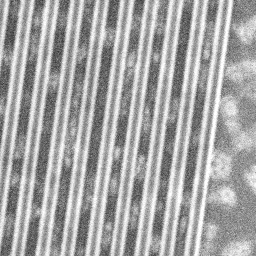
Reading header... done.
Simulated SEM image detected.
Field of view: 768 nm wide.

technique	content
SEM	parallel lines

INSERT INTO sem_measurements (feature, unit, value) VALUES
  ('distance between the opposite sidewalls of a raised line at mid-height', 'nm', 30.8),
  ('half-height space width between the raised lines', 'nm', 45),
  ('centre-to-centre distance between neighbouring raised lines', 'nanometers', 73.9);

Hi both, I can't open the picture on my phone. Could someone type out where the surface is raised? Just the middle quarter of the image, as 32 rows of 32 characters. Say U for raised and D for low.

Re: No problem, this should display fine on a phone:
UUDDDDUUDDDDUUUDDDDUUDDDDUUDDDDU
UUDDDDUUDDDDUUUDDDUUUDDDDUUDDDDU
UUDDDDUUDDDDUUUDDDUUDDDDUUUDDDDU
UUDDDDUUDDDDUUDDDDUUDDDDUUUDDDUU
UUDDDDUUDDDDUUDDDDUUDDDDUUUDDDUU
UUDDDDUUDDDDUUDDDDUUDDDDUUDDDDUU
UDDDDUUUDDDDUUDDDDUUDDDDUUDDDDUU
UDDDDUUDDDDUUUDDDDUUDDDDUUDDDDUU
UDDDDUUDDDDUUUDDDUUUDDDDUUDDDDUU
UDDDDUUDDDDUUDDDDUUDDDDUUUDDDDUU
UDDDDUUDDDDUUDDDDUUDDDDUUUDDDUUU
UDDDDUUDDDDUUDDDDUUDDDDUUUDDDUUU
UDDDDUUDDDDUUDDDDUUDDDDUUDDDDUUU
DDDDUUUDDDDUUDDDDUUDDDDUUDDDDUUD
DDDDUUDDDDUUUDDDDUUDDDDUUDDDDUUD
DDDDUUDDDDUUUDDDUUUDDDDUUDDDDUUD
DDDDUUDDDDUUUDDDUUUDDDUUUDDDDUUD
DDDDUUDDDDUUDDDDUUDDDDUUUDDDUUUD
DDDDUUDDDDUUDDDDUUDDDDUUUDDDUUUD
DDDDUUDDDDUUDDDDUUDDDDUUUDDDUUUD
DDDUUUDDDDUUDDDDUUDDDDUUDDDDUUUD
DDDUUUDDDUUUDDDDUUDDDDUUDDDDUUDD
DDDUUDDDDUUUDDDUUUDDDDUUDDDDUUDD
DDDUUDDDDUUUDDDUUUDDDUUUDDDDUUDD
DDDUUDDDDUUUDDDUUDDDDUUUDDDDUUDD
DDDUUDDDDUUDDDDUUDDDDUUUDDDUUUDD
DDDUUDDDDUUDDDDUUDDDDUUUDDDUUUDD
DDUUUDDDDUUDDDDUUDDDDUUDDDDUUUDD
DDUUUDDDDUUDDDDUUDDDDUUDDDDUUDDD
DDUUDDDDUUUDDDDUUDDDDUUDDDDUUDDD
DDUUDDDDUUUDDDUUUDDDDUUDDDDUUDDD
DDUUDDDDUUDDDDUUDDDDUUUDDDDUUDDD